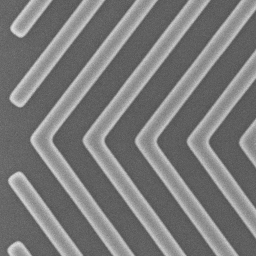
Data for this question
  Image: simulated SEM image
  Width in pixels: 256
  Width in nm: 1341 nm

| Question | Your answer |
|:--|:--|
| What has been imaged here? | groups of lines, slits or small figures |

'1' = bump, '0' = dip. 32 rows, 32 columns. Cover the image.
00011100001110000110000111000011
00011000011100001100000110000111
00111000011000011100001100001110
00110000110000111000011100001100
00100001110000110000111000011000
00000011100001110001110000111000
00000111000011100001100001110000
00000110000111000011000001100001
00001110001110000111000011000011
00011100001100001110000111000011
00111000011100001100001110000110
00110000111000011000011100001110
01100001110000111000011000011100
00000001100001110000111000111000
00000011100011100001110000110000
00000111000011000011100001100000
00001110000111000011000011100001
00001110001110000111000011000011
00001110000110000111000011000011
00000111000011000011100001100001
00000011100011100001100001110000
00000001100001110001110000111000
01100001110000110000111000011000
00110000111000011000011100011100
00111000011000011100001100001110
00011100001100001100001110000110
00001100001110000110000111000011
00001110000111000111000011000011
00000111000011000011100001100001
00000011100011100001100001110000
00100001100001110000110000111000
01110001110000111000111000011000